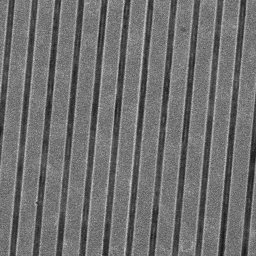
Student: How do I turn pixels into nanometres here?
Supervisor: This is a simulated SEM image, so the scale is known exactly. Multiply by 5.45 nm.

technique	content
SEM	parallel lines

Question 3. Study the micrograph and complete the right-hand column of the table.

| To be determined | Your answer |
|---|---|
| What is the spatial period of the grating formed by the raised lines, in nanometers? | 126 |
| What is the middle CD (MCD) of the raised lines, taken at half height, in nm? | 88.1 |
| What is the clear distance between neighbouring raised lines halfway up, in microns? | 0.0366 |